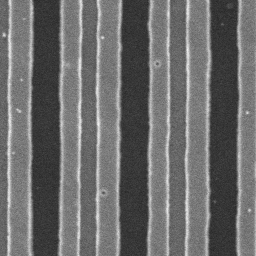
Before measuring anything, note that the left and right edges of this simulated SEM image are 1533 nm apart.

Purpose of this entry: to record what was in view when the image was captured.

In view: lines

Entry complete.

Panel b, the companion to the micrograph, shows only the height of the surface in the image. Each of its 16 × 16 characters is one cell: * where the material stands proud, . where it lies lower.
**..****.****..*
**..****.****..*
**..***..****..*
**..***..****..*
**..***..****..*
**..***..****..*
**..***..****..*
**..***..****..*
**..***..****..*
**..***..****..*
**..***..****..*
**..***..****..*
**..***..****..*
**..***..****..*
**..***..****..*
**..***..****..*